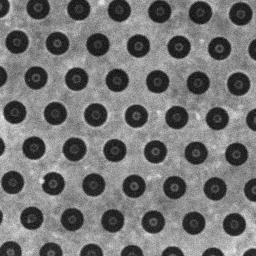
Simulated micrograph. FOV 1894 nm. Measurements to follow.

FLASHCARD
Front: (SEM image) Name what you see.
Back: an array of small figures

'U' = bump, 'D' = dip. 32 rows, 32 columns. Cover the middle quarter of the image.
UUUUUUUUUUUUUUUUUUUUUUUUUUUUUUUU
UDDDDUUUUUUUDDDUUUUUUUUDUUUUUUUU
DDDDDDUUUUUDDDDDUUUUUDDDDDUUUUUU
DDUUDDUUUUDDDUDDUUUUUDDDDDUUUUUD
DDDUDDUUUUDDDUDDUUUUDDDUDDDUUUDD
DDDDDDUUUUUDDDDDUUUUUDDDDDUUUUUD
UUDDDUUUUUUDDDDUUUUUUDDDDDUUUUUD
UUUUUUUUUUUUUUUUUUUUUUUDUUUUUUUU
UUUUUUUUUUUUUUUUUUUUUUUUUUUUUUUU
UUUUUUUUUUUUUUUUUUUUUUUUUUUUUUUU
UUUUUUDDDDUUUUUUDDDDUUUUUUUDDUUU
DUUUUDDDDDDUUUUDDDDDDUUUUUDDDDDU
DUUUUDDUUDDUUUUDDDDDDUUUUDDDUDDU
DUUUUDDUUDDUUUUDDDUDDUUUUDDUUDDU
UUUUUDDDDDDUUUUDDDDDDUUUUDDDDDDU
UUUUUUDDDDUUUUUUDDDDUUUUUUDDDDUU
UUUUUUUUUUUUUUUUUUUUUUUUUUUUUUUU
UUUUUUUUUUUUUUUUUUUUUUUUUUUUUUUU
UDDDUUUUUUUUDUUUUUUUUUUUUUUUUUUU
DDDDDUUUUUDDDDDUUUUUUDDDDUUUUUUU
DDUDDDUUUUDDDDDDUUUUDDDDDUUUUUUD
DDUDDDUUUUDDUUDDUUUUDDUUDDUUUUDD
DDDDDDUUUUDDDDDDUUUUDDUDDDUUUUDD
DDDDDUUUUUDDDDDUUUUUDDDDDUUUUUDD
UUDUUUUUUUUUDDUUUUUUUDDDDUUUUUUD
UUUUUUUUUUUUUUUUUUUUUUUUUUUUUUUU
UUUUUUUUUUUUUUUUUUUUUUUUUUUUUUUU
UUUUUUDDDUUUUUUUUUUUUUUUUUUUUUUU
UUUUUDDDDDUUUUUDDDDDUUUUUUDDDUUU
UUUUUDDDDDUUUUUDDDDDUUUUUDDDDDUU
UUUUDDDUDDUUUUUDDUDDDUUUUDDUDDDU
UUUUUDDDDDUUUUUDDDDDUUUUUDDUDDDU